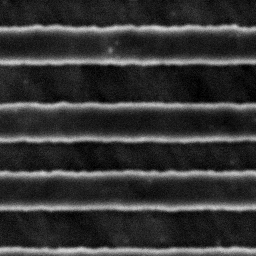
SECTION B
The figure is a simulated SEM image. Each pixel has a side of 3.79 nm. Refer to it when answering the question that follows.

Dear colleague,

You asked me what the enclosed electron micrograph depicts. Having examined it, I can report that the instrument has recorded lines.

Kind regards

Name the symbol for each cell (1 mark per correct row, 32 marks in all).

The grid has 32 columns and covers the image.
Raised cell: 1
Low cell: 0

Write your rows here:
00000000000000000000000000000000
00000000000000000000000000000000
00000000000000000000000000000000
11111111101111111111111111111111
11111111111111111111111111111111
11111111111111111111111111111111
11111111111111111111111111111111
11111111111111111111111111111111
00000000000000000000000000000000
00000000000000000000000000000000
00000000000000000000000000000000
00000000000000000000000000000000
00000000000000000000000000000000
11111111111111111111111111111111
11111111111111111111111111111111
11111111111111111111111111111111
11111111111111111111111111111111
11111111111111111111111111111110
00000000000000000000000000000000
00000000000000000000000000000000
00000000000000000000000000000000
00000001000000011000010010000011
11111111111111111111111111111111
11111111111111111111111111111111
11111111111111111111111111111111
11111111111111111111111111111111
00000000000000000000000000000000
00000000000000000000000000000000
00000000000000000000000000000000
00000000000000000000000000000000
00000000000000000000000000000000
11111111111111111111111111111111